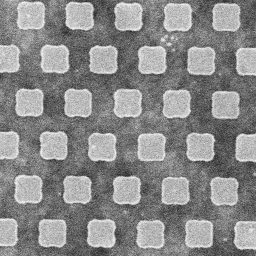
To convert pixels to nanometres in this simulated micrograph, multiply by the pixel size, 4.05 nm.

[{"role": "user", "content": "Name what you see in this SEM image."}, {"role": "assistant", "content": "a regular array of raised bodies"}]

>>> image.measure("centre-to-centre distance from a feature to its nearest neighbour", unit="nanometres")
197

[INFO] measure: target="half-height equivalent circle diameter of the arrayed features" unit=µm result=0.118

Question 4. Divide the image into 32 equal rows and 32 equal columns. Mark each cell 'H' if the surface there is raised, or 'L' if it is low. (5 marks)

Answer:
LLLHHLLLLHHLLLLLLLLLLHHLLLLLLLLL
LLHHHLLLHHHHLLHHHHLLLHHHLLLHHHLL
LLHHHLLLHHHHLLHHHHLLLHHHLLLHHHLL
LLLHHLLLLHHLLLLHHLLLLHHHLLLHHHLL
LLLLLLLLLLLLLLLLLLLLLLLLLLLLLLLL
LLLLLLLLLLLLLLLLLLLLLLLLLLLLLLLL
HHLLLHHHLLLHHHHLLHHHHLLLHHHLLLHH
HHLLLHHHHLLHHHLLLHHHHLLLHHHLLLHH
HHLLLHHHLLLHHHHLLHHHHLLLHHHLLLHH
LLLLLLLLLLLLLLLLLLLLLLLLLLLLLLLL
LLLLLLLLLLLLLLLLLLLLLLLLLLLLLLLL
LLHHHLLLHHHLLLLHHLLLLHHLLLLLLLLL
LLHHHLLLHHHLLLHHHHLLHHHHLLLHHHLL
LLHHHLLLHHHLLLHHHHLLHHHHLLLHHHLL
LLLLLLLLLHHLLLLLHLLLLHHLLLLHHHLL
LLLLLLLLLLLLLLLLLLLLLLLLLLLLLLLL
LLLLLLLLLLLLLLLLLLLLLLLLLLLLLLLL
HHLLLHHHLLLHHHLLLHHHHLLHHHHLLLHH
HHLLLHHHLLLHHHLLLHHHLLLLHHHLLLHH
HHLLLHHHLLLHHHLLLHHHLLLLHHHLLLHH
LLLLLLLLLLLLLLLLLLLLLLLLLLLLLLLL
LLLLLLLLLLLLLLLLLLLLLLLLLLLLLLLL
LLHHHLLLHHHLLLHHHLLLLHHLLLLHHLLL
LLHHHLLLHHHLLLHHHLLLHHHHLLHHHHLL
LLHHHLLLHHHLLLHHHLLLHHHHLLHHHHLL
LLLLLLLLLLLLLLLLLLLLLHHLLLLHHLLL
LLLLLLLLLLLLLLLLLLLLLLLLLLLLLLLL
HHLLLHHLLLLLLLLLLLLLLLLLLLLLLLLL
HHLLLHHHLLLHHHLLLHHHLLLHHHHLLHHH
HHLLLHHHLLLHHHLLLHHHLLLHHHHLLHHH
HHLLLHHHLLLHHHLLLHHHLLLHHHLLLHHH
LLLLLLLLLLLLLLLLLLLLLLLLLLLLLLLL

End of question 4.